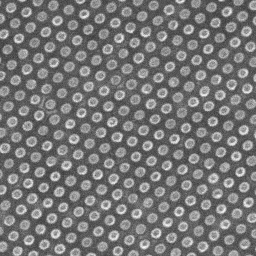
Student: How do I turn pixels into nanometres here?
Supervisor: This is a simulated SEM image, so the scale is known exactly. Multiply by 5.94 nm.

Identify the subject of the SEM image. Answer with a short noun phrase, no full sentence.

a regular array of raised bodies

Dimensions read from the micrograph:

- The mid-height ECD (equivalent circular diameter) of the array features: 55.7 nm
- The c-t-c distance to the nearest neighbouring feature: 0.0932 µm